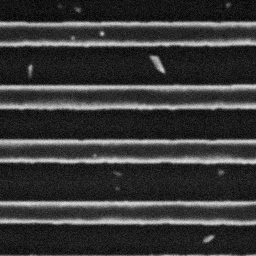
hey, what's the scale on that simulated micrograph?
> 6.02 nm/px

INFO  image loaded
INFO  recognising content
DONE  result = lines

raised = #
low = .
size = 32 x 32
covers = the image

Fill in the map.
................................
................................
................................
################################
################################
#############################..#
................................
................................
................................
................................
................................
################################
################################
..###.#..#####..########..#.....
................................
................................
................................
................................
################################
################################
................................
................................
................................
................................
................................
################################
################################
################################
................................
................................
................................
................................